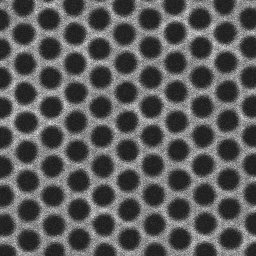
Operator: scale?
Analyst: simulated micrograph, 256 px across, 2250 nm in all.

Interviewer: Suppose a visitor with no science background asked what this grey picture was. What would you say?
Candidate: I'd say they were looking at a regular array of holes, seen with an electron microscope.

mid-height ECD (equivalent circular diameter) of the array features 196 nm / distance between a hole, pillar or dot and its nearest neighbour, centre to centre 28.7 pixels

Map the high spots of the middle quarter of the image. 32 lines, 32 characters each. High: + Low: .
......+++++++.....+++++++......+
.....++....++.....++....++....++
+...+++.....+++.+++.....+++..+++
++++++......+++++++......++++++.
+++++++.....+++..++.....+++..+++
+....++....++.....++....++....++
......+++++++.....+++++++......+
......+++++++.....+++++++......+
.....+++...++.....++....++....++
+....++.....++...++.....+++..+++
++++++......+++++++......+++++++
+++++++.....+++++++.....++++++++
+....++....+++....++....++....++
......++..+++.....+++.++++.....+
......+++++++.....+++++++......+
......++...++.....+++..+++.....+
+....++.....++...+++....++....++
+++++++.....+++++++......+++++++
+++++++.....+++++++......+++++++
++...++.....++...+++....+++...++
+.....++...++.....+++..+++.....+
......+++++++......+++++++.....+
......+++++++......+++++++.....+
+....+++....++....++....++.....+
+++.+++.....++++++++.....+++++++
+++++++.....+++++++......+++++++
+++.+++.....++++.+++.....+++..++
++....++....++....++....++.....+
+.....+++++++......+++++++......
+.....+++++++......+++++++......
+.....+++..++.....+++...++.....+
++....++....++....++.....++...++